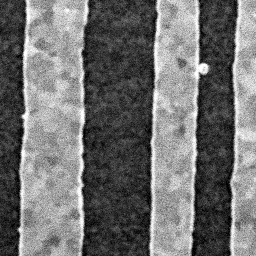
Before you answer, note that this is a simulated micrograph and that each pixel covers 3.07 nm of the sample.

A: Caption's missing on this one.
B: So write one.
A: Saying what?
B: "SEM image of one or a few lines or trenches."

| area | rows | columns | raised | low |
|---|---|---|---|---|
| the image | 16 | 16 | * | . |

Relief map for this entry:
..***.....**...*
..***.....**...*
..***.....**...*
.****.....**...*
.****.....***..*
..***.....**...*
..***.....**...*
..***.....**...*
..***.....**...*
.****.....**...*
.****.....**...*
.****.....**..**
.****.....**...*
.****....***...*
.****....***...*
.****....***..**